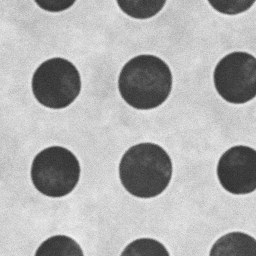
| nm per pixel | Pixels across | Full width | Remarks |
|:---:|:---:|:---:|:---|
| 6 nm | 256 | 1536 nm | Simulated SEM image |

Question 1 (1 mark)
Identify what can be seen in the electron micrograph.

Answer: holes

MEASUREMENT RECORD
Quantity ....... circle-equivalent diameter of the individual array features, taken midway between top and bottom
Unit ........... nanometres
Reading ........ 320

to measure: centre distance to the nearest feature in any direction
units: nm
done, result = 529